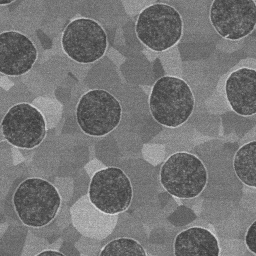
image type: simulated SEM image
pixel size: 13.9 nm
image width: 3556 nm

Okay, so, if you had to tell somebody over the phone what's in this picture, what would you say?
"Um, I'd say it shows holes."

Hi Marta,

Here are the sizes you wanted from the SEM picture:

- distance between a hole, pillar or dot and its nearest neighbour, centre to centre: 1030 nm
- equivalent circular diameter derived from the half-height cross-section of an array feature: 624 nm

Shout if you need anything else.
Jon